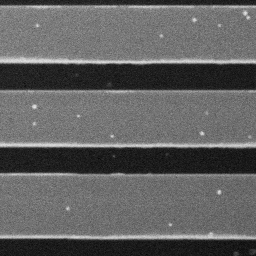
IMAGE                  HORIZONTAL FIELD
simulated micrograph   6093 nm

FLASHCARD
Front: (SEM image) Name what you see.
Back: lines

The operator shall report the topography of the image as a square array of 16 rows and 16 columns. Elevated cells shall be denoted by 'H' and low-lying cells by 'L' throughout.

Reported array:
HHHHHHHHHHHHHHHH
HHHHHHHHHHHHHHHH
HHHHHHHHHHHHHHHH
HHHHHHHHHHHHHHHH
LLLLLLLLLLLLLLLL
LLLLLLLLLLLLLLLL
HHHHHHHHHHHHHHHH
HHHHHHHHHHHHHHHH
HHHHHHHHHHHHHHHH
LLLLLLLLLLLLLLLL
LLLLLLLLLLLLLLLL
HHHHHHHHHHHHHHHH
HHHHHHHHHHHHHHHH
HHHHHHHHHHHHHHHH
HHHHHHHHHHHHHHHH
LLLLLLLLLLLLLLLL